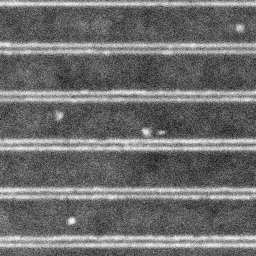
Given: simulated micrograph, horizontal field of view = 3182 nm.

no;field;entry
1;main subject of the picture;lines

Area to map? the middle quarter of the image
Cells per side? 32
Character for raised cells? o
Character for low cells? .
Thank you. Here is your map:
................................
................................
................................
................................
................................
................................
................................
oooooooooooooooooooooooooooooooo
oooooooooooooooooooooooooooooooo
................................
................................
................................
................................
................................
................................
................................
................................
................................
................................
oooooooooooooooooooooooooooooooo
oooooooooooooooooooooooooooooooo
................................
................................
................................
................................
................................
................................
................................
................................
................................
................................
.ooooooooooooooooo.ooo...ooooooo